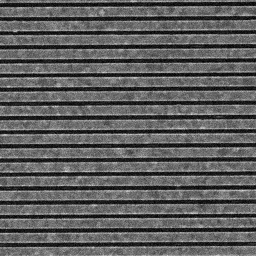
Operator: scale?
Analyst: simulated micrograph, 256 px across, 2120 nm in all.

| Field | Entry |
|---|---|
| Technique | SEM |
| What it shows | parallel lines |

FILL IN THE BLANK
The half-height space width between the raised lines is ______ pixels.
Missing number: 5.25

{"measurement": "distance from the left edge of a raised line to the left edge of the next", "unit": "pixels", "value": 14.1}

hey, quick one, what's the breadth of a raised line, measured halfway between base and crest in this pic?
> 75.6 nm